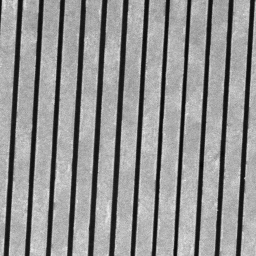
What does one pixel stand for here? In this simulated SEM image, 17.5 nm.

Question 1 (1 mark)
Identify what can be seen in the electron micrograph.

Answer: parallel lines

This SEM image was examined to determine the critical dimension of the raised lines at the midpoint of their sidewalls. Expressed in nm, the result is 279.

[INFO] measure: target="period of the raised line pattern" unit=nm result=368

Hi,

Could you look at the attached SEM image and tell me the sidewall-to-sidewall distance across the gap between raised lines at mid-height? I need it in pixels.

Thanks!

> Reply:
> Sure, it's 4.99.